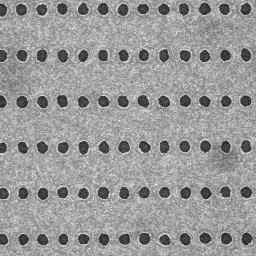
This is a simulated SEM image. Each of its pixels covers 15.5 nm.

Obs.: a regular array of holes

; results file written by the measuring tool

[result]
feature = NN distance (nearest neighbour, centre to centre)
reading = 0.308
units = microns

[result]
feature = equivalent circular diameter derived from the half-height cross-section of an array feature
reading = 187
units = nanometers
